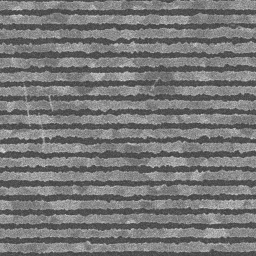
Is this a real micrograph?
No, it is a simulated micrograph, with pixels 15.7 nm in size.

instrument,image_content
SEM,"parallel lines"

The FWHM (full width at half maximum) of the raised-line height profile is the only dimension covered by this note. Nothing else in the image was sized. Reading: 124 nm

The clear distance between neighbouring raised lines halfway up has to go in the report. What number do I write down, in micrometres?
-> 0.0944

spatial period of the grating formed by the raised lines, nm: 224